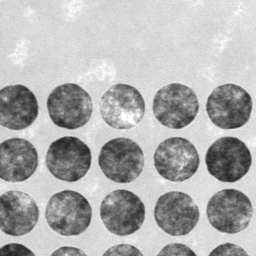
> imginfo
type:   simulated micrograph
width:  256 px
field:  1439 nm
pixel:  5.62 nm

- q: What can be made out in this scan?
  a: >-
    a regular array of holes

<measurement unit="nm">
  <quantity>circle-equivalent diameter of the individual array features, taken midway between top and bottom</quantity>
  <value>259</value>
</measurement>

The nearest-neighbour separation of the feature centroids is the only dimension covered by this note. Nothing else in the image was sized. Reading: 296 nm